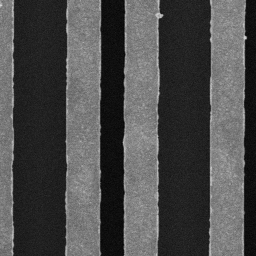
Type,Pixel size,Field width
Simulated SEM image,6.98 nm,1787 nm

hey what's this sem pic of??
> lines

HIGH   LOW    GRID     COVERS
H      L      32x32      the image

HHLLLLLLHHHHHLLLHHHHLLLLLLHHHHHL
HHLLLLLLHHHHHLLLHHHHLLLLLLHHHHHL
HHLLLLLLHHHHHLLLHHHHLLLLLLHHHHHL
HHLLLLLLHHHHHLLLHHHHLLLLLLHHHHHL
HHLLLLLLHHHHHLLLHHHHLLLLLLHHHHHL
HHLLLLLLHHHHHLLLHHHHLLLLLLHHHHHL
HHLLLLLLHHHHHLLLHHHHLLLLLLHHHHHL
HHLLLLLLHHHHHLLLHHHHLLLLLLHHHHHL
HHLLLLLLHHHHHLLLHHHHLLLLLLHHHHHL
HHLLLLLLHHHHHLLLHHHHLLLLLLHHHHHL
HHLLLLLLHHHHLLLLHHHHLLLLLLHHHHHL
HHLLLLLLHHHHHLLLHHHHLLLLLLHHHHHL
HHLLLLLLHHHHHLLLHHHHLLLLLLHHHHHL
HHLLLLLLHHHHLLLLHHHHLLLLLLHHHHHL
HHLLLLLLHHHHLLLLHHHHLLLLLLHHHHHL
HHLLLLLLHHHHHLLLHHHHLLLLLLHHHHHL
HHLLLLLLHHHHHLLLHHHHLLLLLLHHHHHL
HHLLLLLLHHHHLLLHHHHHLLLLLLHHHHLL
HHLLLLLLHHHHLLLHHHHHLLLLLLHHHHHL
HHLLLLLLHHHHLLLLHHHHLLLLLLHHHHHL
HHLLLLLLHHHHLLLLHHHHLLLLLLHHHHHL
HHLLLLLLHHHHHLLLHHHHLLLLLLHHHHLL
HHLLLLLLHHHHLLLLHHHHLLLLLLHHHHLL
HHLLLLLLHHHHHLLLHHHHLLLLLLHHHHLL
HHLLLLLLHHHHHLLLHHHHLLLLLLHHHHLL
HHLLLLLLHHHHHLLLHHHHLLLLLLHHHHLL
HHLLLLLLHHHHLLLLHHHHLLLLLLHHHHLL
HHLLLLLLHHHHHLLLHHHHLLLLLLHHHHLL
HHLLLLLLHHHHLLLLHHHHLLLLLLHHHHLL
HHLLLLLLHHHHLLLLHHHHLLLLLLHHHHLL
HHLLLLLLHHHHLLLLHHHHLLLLLLHHHHLL
HHLLLLLLHHHHHLLLHHHHLLLLLLHHHHLL